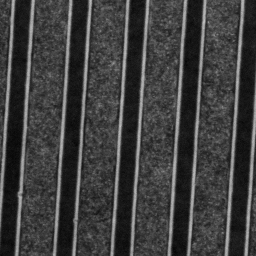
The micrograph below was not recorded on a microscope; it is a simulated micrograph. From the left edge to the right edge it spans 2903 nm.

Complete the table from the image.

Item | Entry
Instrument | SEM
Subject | parallel lines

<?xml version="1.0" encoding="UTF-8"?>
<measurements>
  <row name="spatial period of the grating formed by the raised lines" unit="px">57.2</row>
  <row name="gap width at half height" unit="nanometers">416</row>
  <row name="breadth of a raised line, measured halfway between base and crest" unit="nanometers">230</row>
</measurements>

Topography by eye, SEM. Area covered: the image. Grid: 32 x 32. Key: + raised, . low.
..++.....++.....++.....+++....++
..++.....++.....++.....+++....++
..++.....++.....++.....+++....++
..++.....++.....++.....++.....++
.+++.....++.....++.....++.....++
.+++.....++.....++.....++.....++
.+++....+++.....++.....++.....++
.+++....+++.....++.....++.....++
.+++....+++....+++.....++.....++
.+++....+++....+++.....++.....++
.+++....+++....+++....+++.....++
.++.....+++....+++....+++.....++
.++.....+++....+++....+++....+++
.++.....++.....+++....+++.....++
.++.....++.....+++....+++....+++
.++.....++.....++.....+++....+++
.++.....++.....++.....+++....+++
.++.....++.....++.....++.....+++
.++.....++.....++.....++.....+++
+++.....++.....++.....++.....+++
+++.....++.....++.....++.....+++
+++....+++.....++.....++.....++.
+++....+++.....++.....++.....++.
+++....+++....+++.....++.....++.
+++....+++....+++.....++.....++.
+++....+++....+++.....++.....++.
++.....+++....+++....+++.....++.
++.....+++....+++....+++.....++.
++.....+++....+++....+++....+++.
++.....++.....+++....+++....+++.
++.....++.....+++....+++....+++.
++.....++.....++.....+++....+++.